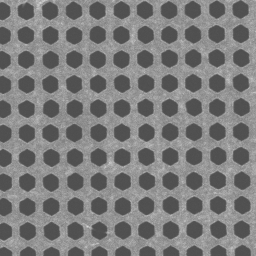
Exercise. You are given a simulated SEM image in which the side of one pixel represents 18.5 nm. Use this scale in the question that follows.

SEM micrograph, a regular array of holes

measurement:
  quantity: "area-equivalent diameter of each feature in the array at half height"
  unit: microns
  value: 0.322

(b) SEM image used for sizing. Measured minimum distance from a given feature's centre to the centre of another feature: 437 nanometres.